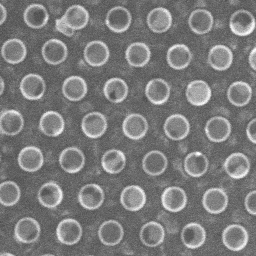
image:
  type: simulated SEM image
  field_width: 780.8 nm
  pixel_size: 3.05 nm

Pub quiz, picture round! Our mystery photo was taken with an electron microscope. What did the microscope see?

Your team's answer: a regular array of raised bodies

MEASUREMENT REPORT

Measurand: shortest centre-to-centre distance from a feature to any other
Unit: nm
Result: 125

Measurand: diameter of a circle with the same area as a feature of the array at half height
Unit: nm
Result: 71.5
